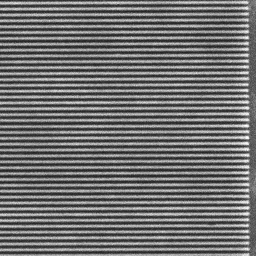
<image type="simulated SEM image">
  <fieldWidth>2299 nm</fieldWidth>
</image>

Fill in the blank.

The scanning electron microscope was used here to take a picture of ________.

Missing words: parallel lines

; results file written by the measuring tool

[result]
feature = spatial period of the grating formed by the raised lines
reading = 52.7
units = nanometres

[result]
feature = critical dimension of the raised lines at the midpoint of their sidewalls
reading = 0.0224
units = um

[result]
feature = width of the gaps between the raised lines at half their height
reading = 30.3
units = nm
